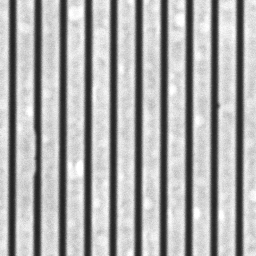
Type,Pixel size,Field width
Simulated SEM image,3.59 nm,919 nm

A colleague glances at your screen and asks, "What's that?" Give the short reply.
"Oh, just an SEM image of parallel lines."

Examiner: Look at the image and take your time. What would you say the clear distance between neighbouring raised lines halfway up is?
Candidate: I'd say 25.1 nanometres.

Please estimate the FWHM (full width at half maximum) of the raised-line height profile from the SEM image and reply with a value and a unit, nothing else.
18.2 pixels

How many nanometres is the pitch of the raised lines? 90.6